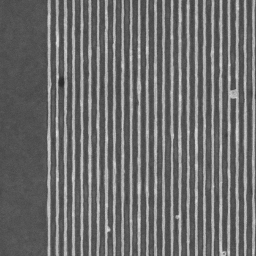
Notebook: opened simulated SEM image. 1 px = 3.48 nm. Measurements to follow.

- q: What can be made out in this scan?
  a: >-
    parallel lines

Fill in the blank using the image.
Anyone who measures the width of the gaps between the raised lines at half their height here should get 0.02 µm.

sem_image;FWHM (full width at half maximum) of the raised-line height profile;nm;7.4